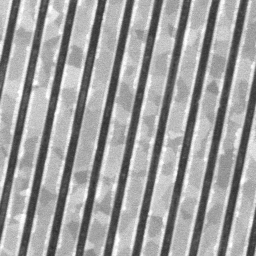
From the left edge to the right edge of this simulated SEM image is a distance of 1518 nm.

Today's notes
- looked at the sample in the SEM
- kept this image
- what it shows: parallel lines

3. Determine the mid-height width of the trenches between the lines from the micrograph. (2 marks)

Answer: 53.8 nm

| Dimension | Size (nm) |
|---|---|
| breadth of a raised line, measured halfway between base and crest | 108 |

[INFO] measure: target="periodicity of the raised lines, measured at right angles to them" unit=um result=0.166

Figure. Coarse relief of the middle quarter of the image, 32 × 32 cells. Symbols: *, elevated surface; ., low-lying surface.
*****...****..*****...****...***
*****..*****..*****..*****...***
****...*****..*****..*****..****
****...****...****...*****..****
****...****...****...****...****
****..*****..*****...****...****
****..*****..*****..*****...****
***...*****..*****..*****..*****
***...****...****...*****..*****
***...****...****...****...*****
***..*****..*****...****...****.
***..*****..*****..*****...****.
**...*****..*****..*****..*****.
**...****...****...*****..*****.
**...****...****...****...*****.
**..*****..*****...****...****..
**..*****..*****..*****...****..
**..*****..*****..*****..*****..
*...****...****...*****..*****..
*...****...****...****...*****..
*..*****..*****...****...****...
*..*****..*****..*****...****...
...*****..*****..*****..*****...
...****...****...*****..*****..*
...****...****...****...****...*
..*****..*****...****...****...*
..*****..*****..*****...****...*
..*****..*****..*****..*****...*
..****...****...*****..*****..**
..****...****...****...*****..**
.*****..*****...****...****...**
.*****..*****..*****...****...**